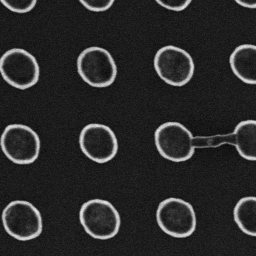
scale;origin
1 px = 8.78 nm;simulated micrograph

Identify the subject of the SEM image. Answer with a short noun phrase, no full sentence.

raised bodies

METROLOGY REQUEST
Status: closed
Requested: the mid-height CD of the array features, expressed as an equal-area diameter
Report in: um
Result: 0.323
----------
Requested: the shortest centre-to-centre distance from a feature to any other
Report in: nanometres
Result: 671